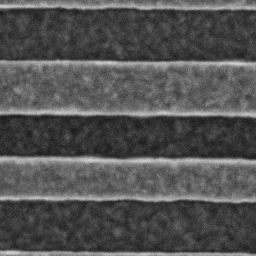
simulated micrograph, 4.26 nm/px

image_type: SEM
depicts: lines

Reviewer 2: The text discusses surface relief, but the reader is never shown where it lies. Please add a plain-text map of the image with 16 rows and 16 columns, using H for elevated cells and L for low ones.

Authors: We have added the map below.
LLLLHHHLHHHHHHHH
LLLLLLLLLLLLLLLL
LLLLLLLLLLLLLLLL
LLLLLLLLLLLLLLLL
HHHHHHHHHHHHHHHH
HHHHHHHHHHHHHHHH
HHHHHHHHHHHHHHHH
LLLLLLLLLLLLLLLL
LLLLLLLLLLLLLLLL
LLLLLLLLLLLLLLLL
HHHHHHHHHHHHHHHH
HHHHHHHHHHHHHHHH
LLLLLLLLLHHLHHHH
LLLLLLLLLLLLLLLL
LLLLLLLLLLLLLLLL
LLLLLLLLLLLLLLLL